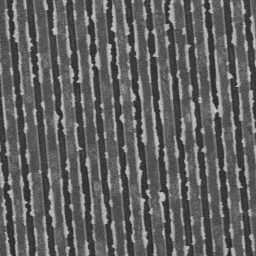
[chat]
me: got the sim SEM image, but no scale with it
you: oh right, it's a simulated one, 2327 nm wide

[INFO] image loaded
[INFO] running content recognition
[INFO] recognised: parallel lines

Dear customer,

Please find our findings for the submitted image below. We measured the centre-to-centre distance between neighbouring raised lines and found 178 nanometres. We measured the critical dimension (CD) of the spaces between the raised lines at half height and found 58.8 nm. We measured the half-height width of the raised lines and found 117 nanometres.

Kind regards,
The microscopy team